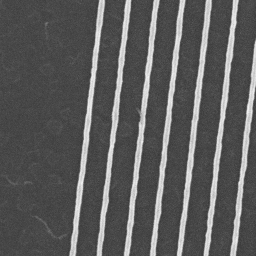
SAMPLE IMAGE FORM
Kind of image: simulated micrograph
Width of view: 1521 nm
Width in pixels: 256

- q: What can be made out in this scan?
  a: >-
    parallel lines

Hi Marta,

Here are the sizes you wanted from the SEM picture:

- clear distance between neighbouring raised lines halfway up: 132 nanometres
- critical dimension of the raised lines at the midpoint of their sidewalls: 27.3 nanometres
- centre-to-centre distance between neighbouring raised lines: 158 nanometres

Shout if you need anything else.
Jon